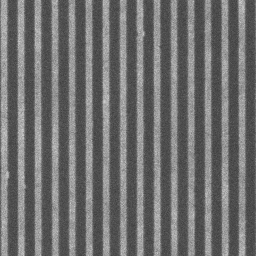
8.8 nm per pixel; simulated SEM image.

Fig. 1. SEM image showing parallel lines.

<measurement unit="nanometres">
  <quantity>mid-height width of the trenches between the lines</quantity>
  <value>86.9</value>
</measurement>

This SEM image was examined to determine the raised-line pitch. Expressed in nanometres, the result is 150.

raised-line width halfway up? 61.6 nm